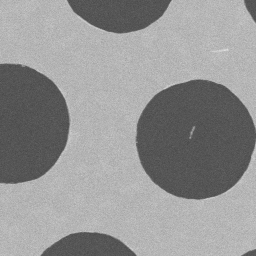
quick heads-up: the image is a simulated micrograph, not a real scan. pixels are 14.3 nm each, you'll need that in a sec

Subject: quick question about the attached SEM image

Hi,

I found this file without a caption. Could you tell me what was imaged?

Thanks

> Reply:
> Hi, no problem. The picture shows holes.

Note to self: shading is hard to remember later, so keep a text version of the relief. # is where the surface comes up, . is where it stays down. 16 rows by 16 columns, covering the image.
####......#####.
######...#######
################
################
..##############
....######....##
....#####......#
....#####.......
....####........
....#####.......
...######......#
##########.....#
################
################
################
###.....########